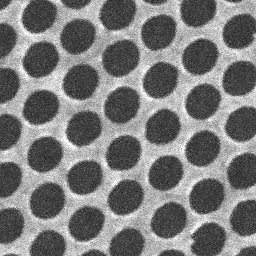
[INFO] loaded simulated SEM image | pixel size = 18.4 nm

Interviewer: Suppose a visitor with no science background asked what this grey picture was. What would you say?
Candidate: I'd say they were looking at a regular array of holes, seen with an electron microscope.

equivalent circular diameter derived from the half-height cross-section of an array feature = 688 nm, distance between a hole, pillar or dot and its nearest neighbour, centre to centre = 824 nanometers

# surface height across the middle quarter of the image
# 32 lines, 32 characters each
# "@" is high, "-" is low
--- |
@@-----@@@---------@@@------@@--
@-------@@--------@@@-------@@--
---------@@-----@@@@---------@@-
---------@@@@-@@@@@@---------@@@
---------@@@@@@@@@@----------@@@
---------@@@@@--@@@---------@@@@
--------@@@@------@@--------@@@-
-------@@@@--------@-------@@@@-
@-----@@@@---------@@----@@@@@--
@@@@@@@@@@---------@@@@@@@@@@@--
@@@@@@@@@@---------@@@@@@@@@@@--
@@@@@-@@@@---------@@@@----@@@--
@@@-----@@--------@@@@------@@@-
@@-------@--------@@@--------@@@
@--------@@@----@@@@---------@@@
@---------@@@@@@@@@@---------@@@
----------@@@@@@@@@@---------@@@
---------@@@@@@-@@@@---------@@@
@--------@@@@-----@@--------@@@-
@------@@@@--------@@------@@@@-
@@----@@@@@--------@@@@--@@@@@--
@@@@@@@@@@----------@@@@@@@@@@--
@@@@@@@@@@---------@@@@@@-@@@@--
@@@@@@@@@@---------@@@@------@--
@@@------@---------@@@-------@@-
@@-------@@-------@@@@--------@@
@---------@@----@@@@@---------@@
@---------@@@@@@@@@@@---------@@
----------@@@@@@@@@@@---------@@
@---------@@@------@@--------@@@
@--------@@@--------@@------@@@@
@-------@@@@--------@@@----@@@@@